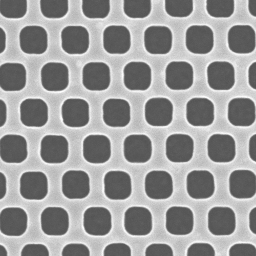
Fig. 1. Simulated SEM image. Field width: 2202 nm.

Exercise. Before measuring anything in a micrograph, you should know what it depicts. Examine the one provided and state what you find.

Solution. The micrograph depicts a regular array of holes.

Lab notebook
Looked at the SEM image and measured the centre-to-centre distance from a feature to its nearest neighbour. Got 41.4 px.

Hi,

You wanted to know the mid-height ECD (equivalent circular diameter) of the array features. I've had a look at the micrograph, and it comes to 255 nanometres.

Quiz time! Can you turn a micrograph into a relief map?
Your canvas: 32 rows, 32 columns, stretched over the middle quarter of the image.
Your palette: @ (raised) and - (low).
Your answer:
@@@@@------@@@@------@@@@@------
-@@@-------@@@@-------@@@-------
-@@@--------@@@-------@@@-------
-@@@--------@@@-------@@@-------
-@@@@-------@@@-------@@@-------
-@@@@------@@@@------@@@@@------
@@@@@@----@@@@@@----@@@@@@@-@@@@
@@@@@@@@@@@@@@@@@@@@@@@@@@@@@@@@
@@@@@@@@@@@@--@@@@@@@@---@@@@@@@
------@@@@------@@@@@------@@@@-
------@@@@------@@@@-------@@@@-
------@@@@-------@@@-------@@@@-
------@@@@-------@@@-------@@@@-
------@@@@-------@@@-------@@@@-
------@@@@------@@@@@------@@@@-
@----@@@@@@----@@@@@@@----@@@@@@
@@@@@@@@@@@@@@@@@@@@@@@@@@@@@@@@
@@@@@@@@@@@@@@@@@---@@@@@@@---@@
@@@@@------@@@@@-----@@@@@------
-@@@@-------@@@-------@@@-------
-@@@@-------@@@-------@@@-------
-@@@@-------@@@-------@@@-------
-@@@@-------@@@-------@@@-------
-@@@@------@@@@-------@@@@------
@@@@@@----@@@@@@-----@@@@@@----@
@@@@@@@@@@@@@@@@@@@@@@@@@@@@@@@@
@@@@@@@@@@@@@@@@@@@@@@@@@@@@@@@@
------@@@@------@@@@@-----@@@@@-
------@@@@-------@@@-------@@@@-
-------@@@-------@@@-------@@@@-
-------@@@-------@@@-------@@@@-
------@@@@-------@@@-------@@@@-